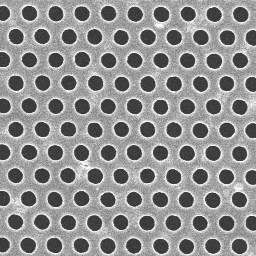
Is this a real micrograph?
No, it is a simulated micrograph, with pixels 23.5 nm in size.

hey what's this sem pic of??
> a regular array of holes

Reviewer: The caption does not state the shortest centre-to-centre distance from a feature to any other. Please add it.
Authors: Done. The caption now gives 612 nm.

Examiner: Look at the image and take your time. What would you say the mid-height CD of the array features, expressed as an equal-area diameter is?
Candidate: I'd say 364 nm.